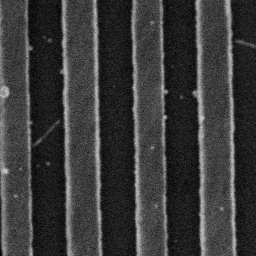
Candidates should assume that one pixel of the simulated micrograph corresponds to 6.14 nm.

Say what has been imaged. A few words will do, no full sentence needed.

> lines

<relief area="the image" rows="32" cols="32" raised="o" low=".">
ooo.....oooo.....ooo.....oooo...
ooo.....oooo.....ooo.....oooo...
ooo.....oooo.....ooo.....oooo...
ooo.....oooo.....ooo.....oooo...
ooo.....oooo.....ooo.....oooo...
ooo.....oooo.....ooo.....oooo...
ooo.....oooo.....ooo.....oooo...
ooo.....oooo.....ooo.....oooo...
ooo.....oooo.....ooo.....oooo...
ooo.....oooo.....ooo.....oooo...
ooo.....oooo.....ooo.....oooo...
oooo....oooo.....ooo.....oooo...
oooo....oooo.....oooo....oooo...
oooo....oooo.....oooo....oooo...
oooo....oooo.....oooo....oooo...
oooo....oooo.....oooo....oooo...
oooo....oooo.....oooo....oooo...
oooo....oooo.....oooo....oooo...
oooo....oooo.....oooo....oooo...
oooo....oooo.....oooo....oooo...
oooo....oooo.....oooo....oooo...
oooo....oooo.....oooo....oooo...
oooo....oooo.....oooo....oooo...
oooo....oooo.....oooo....oooo...
oooo....oooo.....oooo....oooo...
oooo....oooo.....oooo....oooo...
oooo....oooo.....oooo....oooo...
oooo....ooooo....oooo....oooo...
oooo....ooooo....oooo....oooo...
oooo....ooooo....oooo....oooo...
oooo.....oooo....oooo....oooo...
oooo.....oooo....oooo....oooo...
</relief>